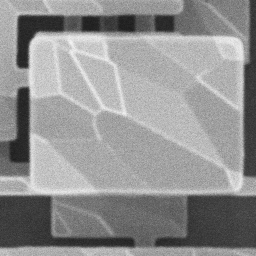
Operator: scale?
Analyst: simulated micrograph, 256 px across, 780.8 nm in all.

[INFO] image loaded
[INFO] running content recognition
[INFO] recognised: wiring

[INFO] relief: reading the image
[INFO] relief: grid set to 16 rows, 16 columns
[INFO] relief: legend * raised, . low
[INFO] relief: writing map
...***..........
................
..*************.
..*************.
..*************.
..*************.
..*************.
*.*************.
..*************.
..*************.
..*************.
..*************.
................
................
................
................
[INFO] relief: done